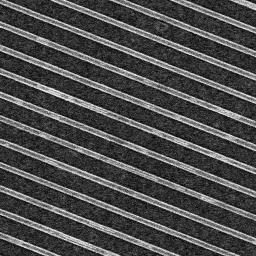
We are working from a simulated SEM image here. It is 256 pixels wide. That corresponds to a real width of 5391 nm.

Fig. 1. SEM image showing parallel lines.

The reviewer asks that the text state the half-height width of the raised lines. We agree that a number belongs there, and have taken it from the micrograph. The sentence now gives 4.43 px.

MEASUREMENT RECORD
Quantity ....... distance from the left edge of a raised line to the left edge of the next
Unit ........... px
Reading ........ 21.8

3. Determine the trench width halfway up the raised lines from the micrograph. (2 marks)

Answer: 368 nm